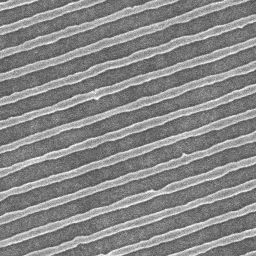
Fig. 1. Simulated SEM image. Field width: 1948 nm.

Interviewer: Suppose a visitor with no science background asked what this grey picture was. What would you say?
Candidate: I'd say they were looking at parallel lines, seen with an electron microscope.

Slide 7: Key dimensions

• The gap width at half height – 116 nm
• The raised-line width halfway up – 7.12 px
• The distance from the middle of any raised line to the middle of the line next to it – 171 nanometres